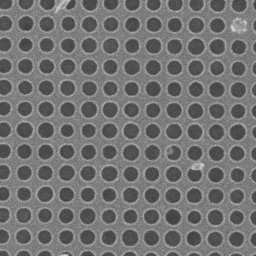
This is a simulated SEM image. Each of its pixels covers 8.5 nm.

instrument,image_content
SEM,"a regular array of holes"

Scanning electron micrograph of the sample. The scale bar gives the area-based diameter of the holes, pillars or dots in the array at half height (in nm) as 130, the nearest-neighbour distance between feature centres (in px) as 21.1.